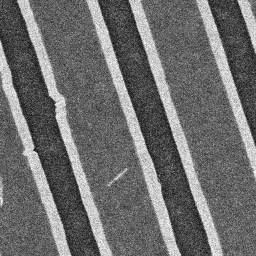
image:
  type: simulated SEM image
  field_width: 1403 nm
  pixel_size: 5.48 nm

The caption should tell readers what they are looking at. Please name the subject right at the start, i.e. one or a few lines or trenches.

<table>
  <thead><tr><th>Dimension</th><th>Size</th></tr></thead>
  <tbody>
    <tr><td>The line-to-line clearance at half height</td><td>212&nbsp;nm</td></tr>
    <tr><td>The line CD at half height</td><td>65.7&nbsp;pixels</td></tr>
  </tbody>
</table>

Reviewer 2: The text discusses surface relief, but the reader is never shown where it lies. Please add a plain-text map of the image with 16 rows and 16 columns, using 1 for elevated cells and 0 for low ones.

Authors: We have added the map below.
0011110001111001
0011110001111000
0011111001111000
0001111000111100
0001111000111100
1001111100111100
1000111100111110
1000111100011110
1100111110011110
1100111110011111
1100011110001111
1110011111001111
1110011111001111
1110001111000111
1111001111000111
1111001111100111